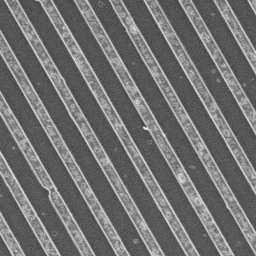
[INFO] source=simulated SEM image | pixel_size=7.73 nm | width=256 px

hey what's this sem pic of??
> parallel lines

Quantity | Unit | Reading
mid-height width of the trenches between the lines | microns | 0.153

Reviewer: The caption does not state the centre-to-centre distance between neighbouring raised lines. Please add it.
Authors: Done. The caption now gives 0.233 µm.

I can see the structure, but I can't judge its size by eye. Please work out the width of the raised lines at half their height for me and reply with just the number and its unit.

0.0803 µm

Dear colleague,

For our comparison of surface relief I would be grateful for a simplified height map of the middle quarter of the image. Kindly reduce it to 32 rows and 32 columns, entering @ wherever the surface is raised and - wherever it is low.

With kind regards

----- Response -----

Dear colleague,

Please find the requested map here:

---@@@------@@@------@@@-----@@@
----@@@------@@@-----@@@@-----@@
----@@@@-----@@@------@@@------@
-----@@@------@@@-----@@@@-----@
------@@@-----@@@------@@@------
@-----@@@------@@@------@@@-----
@------@@@-----@@@------@@@-----
@@-----@@@@-----@@@------@@@----
@@------@@@------@@@-----@@@@---
@@@------@@@-----@@@------@@@---
@@@@-----@@@------@@@------@@---
-@@@------@@@-----@@@@-----@@@--
--@@@-----@@@------@@@------@@@-
--@@@------@@@------@@@-----@@@-
---@@@-----@@@------@@@------@@@
---@@@------@@@------@@@-----@@@
----@@@------@@------@@@------@@
-----@@@-----@@@------@@@------@
-----@@@------@@@-----@@@------@
------@@@-----@@@------@@@------
@-----@@@------@@@------@@------
@------@@@-----@@@------@@@-----
@@------@@------@@@------@@@----
@@------@@@------@@@-----@@@----
@@@------@@@-----@@@------@@@---
-@@------@@@------@@@-----@@@@--
-@@@------@@@-----@@@------@@@--
--@@@-----@@@------@@@------@@@-
--@@@------@@@-----@@@@-----@@@-
---@@@------@@------@@@------@@@
---@@@------@@@------@@@-----@@@
----@@@------@@@-----@@@------@@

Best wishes